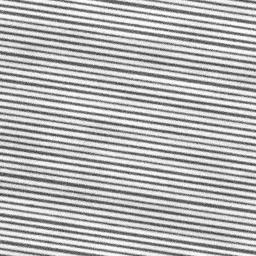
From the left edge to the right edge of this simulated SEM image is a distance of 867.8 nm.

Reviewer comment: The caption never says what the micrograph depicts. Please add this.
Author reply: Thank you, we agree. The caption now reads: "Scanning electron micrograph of parallel lines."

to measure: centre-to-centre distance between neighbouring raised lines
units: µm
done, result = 0.0227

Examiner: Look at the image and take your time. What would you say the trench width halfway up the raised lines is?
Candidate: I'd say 10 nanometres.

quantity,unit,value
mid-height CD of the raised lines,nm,13.4